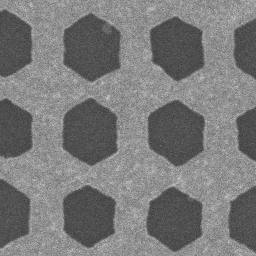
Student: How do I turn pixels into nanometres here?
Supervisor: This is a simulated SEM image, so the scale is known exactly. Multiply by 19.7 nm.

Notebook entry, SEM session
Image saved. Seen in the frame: holes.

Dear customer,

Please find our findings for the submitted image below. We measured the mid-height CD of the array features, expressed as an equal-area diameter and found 1190 nanometers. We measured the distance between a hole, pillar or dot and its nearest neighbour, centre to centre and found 1670 nm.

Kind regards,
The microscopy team